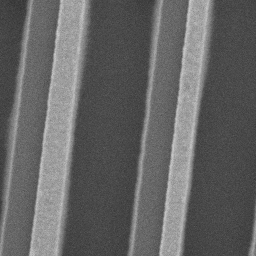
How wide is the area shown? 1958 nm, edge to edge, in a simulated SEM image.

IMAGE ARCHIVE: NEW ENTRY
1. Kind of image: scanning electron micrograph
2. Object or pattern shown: lines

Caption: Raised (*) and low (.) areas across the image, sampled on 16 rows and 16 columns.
..***.....***...
..***.....***...
..***.....***...
.****.....***...
.****.....***...
.****....***....
.****....***....
.***.....***....
.***.....***....
.***.....***....
.***.....***....
.***.....***....
****.....***....
****....****....
****....***.....
****....***.....